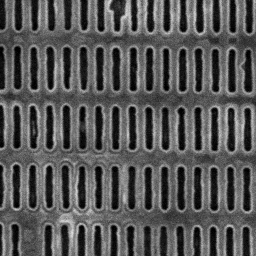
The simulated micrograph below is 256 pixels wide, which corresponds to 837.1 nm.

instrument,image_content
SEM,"a regular array of holes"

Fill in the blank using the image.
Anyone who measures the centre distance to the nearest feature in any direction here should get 16.4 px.